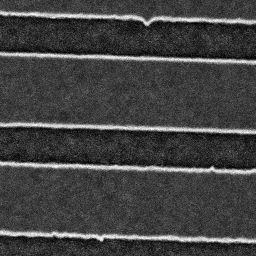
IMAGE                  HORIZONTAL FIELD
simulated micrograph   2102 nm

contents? one or a few lines or trenches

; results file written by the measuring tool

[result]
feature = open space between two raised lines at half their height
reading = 327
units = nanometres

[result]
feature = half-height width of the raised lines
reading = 579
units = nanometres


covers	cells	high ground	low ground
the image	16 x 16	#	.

################
................
................
####............
################
################
################
################
................
................
########........
################
################
################
################
................